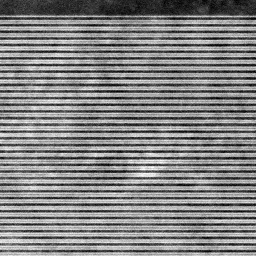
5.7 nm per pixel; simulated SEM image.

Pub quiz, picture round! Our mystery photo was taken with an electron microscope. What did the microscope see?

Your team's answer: parallel lines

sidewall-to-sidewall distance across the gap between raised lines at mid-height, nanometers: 19.9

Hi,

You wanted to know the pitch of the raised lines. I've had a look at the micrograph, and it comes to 37.9 nanometers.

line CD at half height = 2.63 px